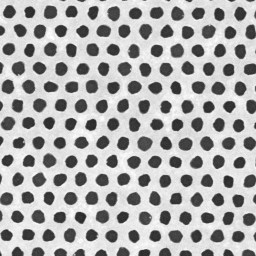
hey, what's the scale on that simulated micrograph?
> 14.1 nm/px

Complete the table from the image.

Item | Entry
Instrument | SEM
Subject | a regular array of holes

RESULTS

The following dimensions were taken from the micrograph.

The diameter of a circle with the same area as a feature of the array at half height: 180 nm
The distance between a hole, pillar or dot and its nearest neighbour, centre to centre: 288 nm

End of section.